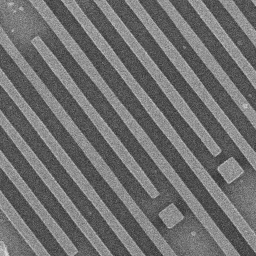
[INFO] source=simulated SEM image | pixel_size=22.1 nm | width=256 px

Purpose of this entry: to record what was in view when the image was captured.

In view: groups of lines, slits or small figures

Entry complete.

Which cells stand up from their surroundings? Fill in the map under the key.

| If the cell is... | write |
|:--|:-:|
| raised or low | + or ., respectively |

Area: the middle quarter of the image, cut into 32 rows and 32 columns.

....+++.....+++.....+++.....+++.
.....+++.....+++.....+++....++++
+.....+++.....+++.....+++....+++
++.....+++.....++.....+++.....++
++.....+++.....+++.....+++.....+
+++.....+++.....+++.....+++.....
.+++.....+++.....+++.....+++....
..+++.....+++.....+++....++++...
...++......++.....++++....++++..
...+++.....+++.....+++.....+++..
....+++.....+++.....+++.....+++.
.....+++.....+++.....+++....++++
+.....+++....+++.....++++....+++
++....+++.....+++.....+++.....++
++.....+++.....+++.....+++.....+
+++.....+++.....+++.....+++....+
.+++.....+++....++++....++++....
..+++....++++....++++....+++....
..+++.....+++.....+++.....+++...
...+++.....+++.....+++.....+++..
....+++.....+++.....+++.....+++.
.....+++....++++....++++....+++.
+....++++....+++.....+++.....+++
+.....++++....+++.....+++.....++
++.....+++.....+++.....+++.....+
+++....++++.....+++....++++....+
.+++....++++....+++.....++++....
.++++....++++....+++.....+++....
..+++.....+++.....+++.....+++...
...+++.....+++.....+++.....+++..
....+++....++++....+++.....+++..
....+++.....+++.....+++.....+++.